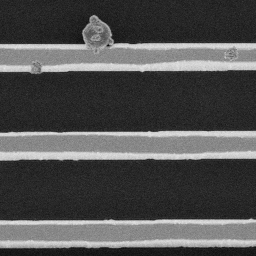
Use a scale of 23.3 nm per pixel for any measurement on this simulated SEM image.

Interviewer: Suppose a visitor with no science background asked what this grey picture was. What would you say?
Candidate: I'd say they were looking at lines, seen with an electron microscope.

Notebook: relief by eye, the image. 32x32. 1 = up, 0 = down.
00000000000000000000000000000000
00000000000000000000000000000000
00000000000110000000000000000000
00000000000111000000000000000000
00000000001111000000000000000000
00000000001111100000011111111111
11111111111111111111111111111111
11111111111111111111111111111111
11111111111111111111100000000000
00000000000000000000000000000000
00000000000000000000000000000000
00000000000000000000000000000000
00000000000000000000000000000000
00000000000000000000000000000000
00000000000000000000000000000000
00000000000000000000000000000000
00000000000000000000000000000001
11111111111111111111111111111111
11111111111111111111111111111111
11111111111111111111111111111111
00000000000000000000000000000000
00000000000000000000000000000000
00000000000000000000000000000000
00000000000000000000000000000000
00000000000000000000000000000000
00000000000000000000000000000000
00000000000000000000000000000000
00000000000000000000000000000000
11111111111111111111111111111111
11111111111111111111111111111111
11111111111111111111111111111111
00000000000000000000000000000000